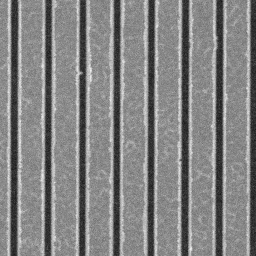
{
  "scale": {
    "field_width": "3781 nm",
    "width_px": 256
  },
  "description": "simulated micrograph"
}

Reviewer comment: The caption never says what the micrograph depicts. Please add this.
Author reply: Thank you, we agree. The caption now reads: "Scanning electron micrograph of parallel lines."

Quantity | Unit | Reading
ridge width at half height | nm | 362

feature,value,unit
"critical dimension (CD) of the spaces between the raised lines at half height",9.75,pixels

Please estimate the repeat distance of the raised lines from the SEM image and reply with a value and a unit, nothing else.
505 nanometres